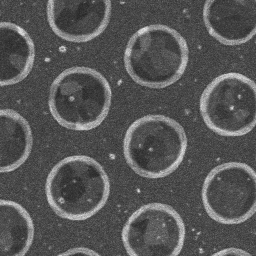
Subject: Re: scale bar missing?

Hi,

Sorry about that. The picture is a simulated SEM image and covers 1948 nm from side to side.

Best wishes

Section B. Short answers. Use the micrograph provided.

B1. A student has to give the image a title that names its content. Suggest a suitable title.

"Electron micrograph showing raised bodies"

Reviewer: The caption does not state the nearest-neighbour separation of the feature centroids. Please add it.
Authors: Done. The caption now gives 664 nm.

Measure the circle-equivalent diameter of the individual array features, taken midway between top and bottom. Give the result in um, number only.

0.445